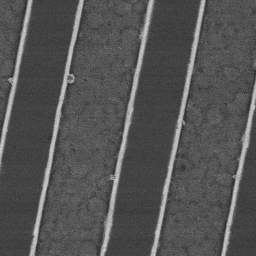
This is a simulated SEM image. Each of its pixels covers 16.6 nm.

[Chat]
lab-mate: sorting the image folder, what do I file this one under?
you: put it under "one or a few lines or trenches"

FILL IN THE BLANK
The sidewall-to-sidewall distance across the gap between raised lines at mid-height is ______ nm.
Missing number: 1140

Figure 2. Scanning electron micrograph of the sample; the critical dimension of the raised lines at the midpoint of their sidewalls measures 844 nm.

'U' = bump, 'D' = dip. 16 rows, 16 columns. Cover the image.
DDUUUDDDDUUUUDDD
DDUUUDDDDUUUDDDD
DUUUUDDDDUUUDDDD
DUUUDDDDDUUUDDDD
DUUUDDDDDUUUDDDD
DUUUDDDDUUUUDDDD
DUUUDDDDUUUDDDDD
UUUUDDDDUUUDDDDD
UUUDDDDDUUUDDDDU
UUUDDDDDUUUDDDDU
UUUDDDDUUUUDDDDU
UUUDDDDUUUDDDDDU
UUUDDDDUUUDDDDDU
UUDDDDDUUUDDDDUU
UUDDDDDUUUDDDDUU
UUDDDDUUUUDDDDUU